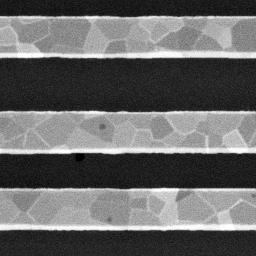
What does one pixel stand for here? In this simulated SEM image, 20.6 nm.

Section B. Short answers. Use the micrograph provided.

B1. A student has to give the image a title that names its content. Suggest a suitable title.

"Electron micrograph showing lines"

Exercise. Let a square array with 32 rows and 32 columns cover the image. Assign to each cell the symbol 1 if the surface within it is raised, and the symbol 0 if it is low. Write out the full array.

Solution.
00000000000000000000000000000000
00000000000000000000000000000000
11111111111111111111111111111111
11111111111111111111111111111111
11111111111111111111111111111111
11111111111111111111111111111111
11111111111111111111111111111111
00000000000000000000000000000000
00000000000000000000000000000000
00000000000000000000000000000000
00000000000000000000000000000000
00000000000000000000000000000000
00000000000000000000000000000000
00000000000000000000000000000000
11111111111111111111111111111111
11111111111111111111111111111111
11111111111111111111111111111111
11111111111111111111111111111111
11111111111111111111111111111111
00000000000000000000000000000000
00000000000000000000000000000000
00000000000000000000000000000000
00000000000000000000000000000000
00000000000000000000000000000000
11111111111111111111111111111111
11111111111111111111111111111111
11111111111111111111111111111111
11111111111111111111111111111111
00000001111111011011110000000000
00000000000000000000000000000000
00000000000000000000000000000000
00000000000000000000000000000000